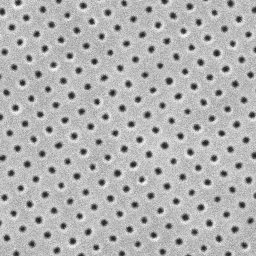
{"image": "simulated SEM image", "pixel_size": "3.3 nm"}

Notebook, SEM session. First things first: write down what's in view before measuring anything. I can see a regular array of holes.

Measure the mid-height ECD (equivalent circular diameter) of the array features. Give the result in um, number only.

0.0221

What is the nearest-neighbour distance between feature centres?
58.2 nanometers